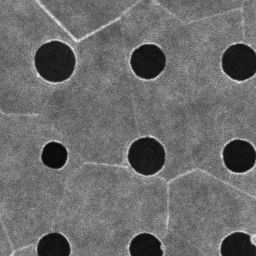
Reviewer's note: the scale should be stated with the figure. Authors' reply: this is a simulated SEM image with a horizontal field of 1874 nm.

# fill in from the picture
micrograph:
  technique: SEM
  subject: holes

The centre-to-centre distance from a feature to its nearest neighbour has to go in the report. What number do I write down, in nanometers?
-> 677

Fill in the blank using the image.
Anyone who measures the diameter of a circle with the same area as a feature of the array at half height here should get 268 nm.